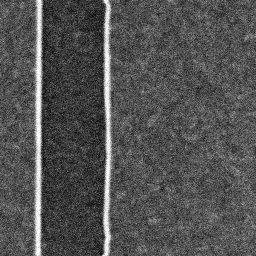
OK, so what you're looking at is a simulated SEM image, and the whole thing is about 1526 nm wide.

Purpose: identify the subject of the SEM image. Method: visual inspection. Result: one or a few lines or trenches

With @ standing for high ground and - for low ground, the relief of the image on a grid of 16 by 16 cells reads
@@-----@@@@@@@@@
@@-----@@@@@@@@@
@@-----@@@@@@@@@
@@-----@@@@@@@@@
@@-----@@@@@@@@@
@@-----@@@@@@@@@
@@-----@@@@@@@@@
@@-----@@@@@@@@@
@@-----@@@@@@@@@
@@-----@@@@@@@@@
@@-----@@@@@@@@@
@@-----@@@@@@@@@
@@-----@@@@@@@@@
@@-----@@@@@@@@@
@@-----@@@@@@@@@
@@-----@@@@@@@@@